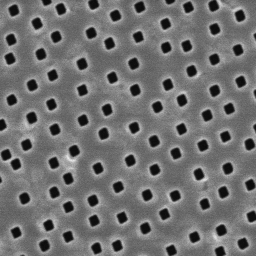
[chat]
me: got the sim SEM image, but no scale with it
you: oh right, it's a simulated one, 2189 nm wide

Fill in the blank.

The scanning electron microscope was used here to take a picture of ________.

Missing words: a regular array of holes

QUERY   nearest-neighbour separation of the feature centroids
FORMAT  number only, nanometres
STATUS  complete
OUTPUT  207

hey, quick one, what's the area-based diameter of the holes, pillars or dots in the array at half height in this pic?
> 97 nanometers